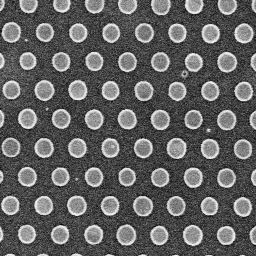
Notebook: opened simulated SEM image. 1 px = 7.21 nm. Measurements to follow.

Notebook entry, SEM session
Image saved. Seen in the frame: a regular array of raised bodies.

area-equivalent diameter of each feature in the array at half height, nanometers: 125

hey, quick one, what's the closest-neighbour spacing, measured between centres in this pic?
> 238 nm